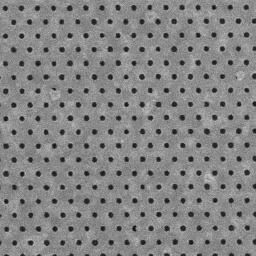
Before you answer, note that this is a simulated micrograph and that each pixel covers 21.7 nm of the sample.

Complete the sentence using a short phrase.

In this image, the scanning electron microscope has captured a regular array of holes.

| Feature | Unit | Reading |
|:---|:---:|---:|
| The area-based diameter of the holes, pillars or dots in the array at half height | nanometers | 130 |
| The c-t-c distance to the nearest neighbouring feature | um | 0.342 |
